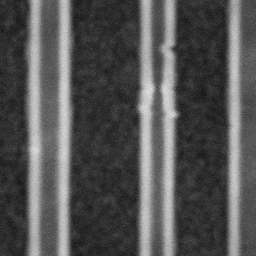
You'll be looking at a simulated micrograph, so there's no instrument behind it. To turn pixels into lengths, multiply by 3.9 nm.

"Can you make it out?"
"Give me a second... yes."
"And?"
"one or a few lines or trenches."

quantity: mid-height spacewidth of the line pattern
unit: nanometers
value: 278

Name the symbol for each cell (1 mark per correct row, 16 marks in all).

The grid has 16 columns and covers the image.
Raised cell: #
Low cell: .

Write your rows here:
..##.....##....#
..##.....##....#
..##.....##....#
..##.....##....#
..##.....##....#
..##.....##....#
..##.....##....#
..##.....##....#
..##.....##....#
..##.....##....#
..##.....##....#
..##.....##....#
..##.....##....#
..##.....##....#
..##.....##....#
..##.....##....#